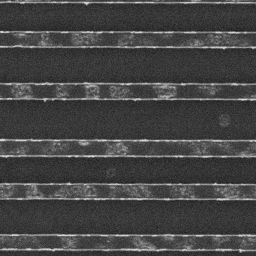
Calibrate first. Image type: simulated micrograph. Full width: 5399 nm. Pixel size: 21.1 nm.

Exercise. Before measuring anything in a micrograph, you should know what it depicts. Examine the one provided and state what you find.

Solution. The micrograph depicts parallel lines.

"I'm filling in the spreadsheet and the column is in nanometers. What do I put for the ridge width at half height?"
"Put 336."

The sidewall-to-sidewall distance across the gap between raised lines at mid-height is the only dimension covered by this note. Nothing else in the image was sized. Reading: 744 nanometres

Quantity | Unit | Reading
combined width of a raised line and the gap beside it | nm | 1070